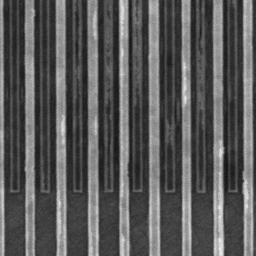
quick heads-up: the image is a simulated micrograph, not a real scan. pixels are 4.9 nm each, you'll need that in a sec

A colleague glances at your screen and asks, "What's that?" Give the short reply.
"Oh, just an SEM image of parallel lines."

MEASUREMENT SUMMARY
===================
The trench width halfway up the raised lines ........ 38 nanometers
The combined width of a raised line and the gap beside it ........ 76.3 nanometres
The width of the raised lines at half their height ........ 38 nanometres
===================